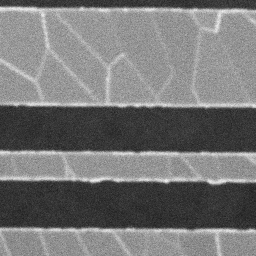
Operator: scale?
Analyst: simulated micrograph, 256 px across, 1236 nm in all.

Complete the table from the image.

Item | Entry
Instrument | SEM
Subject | lines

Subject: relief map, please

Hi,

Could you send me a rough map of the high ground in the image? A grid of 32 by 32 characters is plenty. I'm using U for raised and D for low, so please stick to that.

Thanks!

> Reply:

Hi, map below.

DDDDDDDDDDDDDDDDDDDDDDDDDDDDDDDD
UUUUUUUUUUUUUUUUUUUUUUUUUUUUUUUU
UUUUUUUUUUUUUUUUUUUUUUUUUUUUUUUU
UUUUUUUUUUUUUUUUUUUUUUUUUUUUUUUU
UUUUUUUUUUUUUUUUUUUUUUUUUUUUUUUU
UUUUUUUUUUUUUUUUUUUUUUUUUUUUUUUU
UUUUUUUUUUUUUUUUUUUUUUUUUUUUUUUU
UUUUUUUUUUUUUUUUUUUUUUUUUUUUUUUU
UUUUUUUUUUUUUUUUUUUUUUUUUUUUUUUU
UUUUUUUUUUUUUUUUUUUUUUUUUUUUUUUU
UUUUUUUUUUUUUUUUUUUUUUUUUUUUUUUU
UUUUUUUUUUUUUUUUUUUUUUUUUUUUUUUU
UUUUUUUUUUUUUUUUUUUUUUUUUUUUUUUU
DDDDDDDDDDDDDDDDDDDDDDDDDDDDDDDD
DDDDDDDDDDDDDDDDDDDDDDDDDDDDDDDD
DDDDDDDDDDDDDDDDDDDDDDDDDDDDDDDD
DDDDDDDDDDDDDDDDDDDDDDDDDDDDDDDD
DDDDDDDDDDDDDDDDDDDDDDDDDDDDDDDD
DDDDDDDDDDDDDDDDDDDDDDDDDDDDDDDD
UUUUUUUUUUUUUUUUUUUUUUUUUUUUUUUU
UUUUUUUUUUUUUUUUUUUUUUUUUUUUUUUU
UUUUUUUUUUUUUUUUUUUUUUUUUUUUUUUU
DDDDDDDDDDUUUDUUUUUUUUUUUUUUUUUU
DDDDDDDDDDDDDDDDDDDDDDDDDDDDDDDD
DDDDDDDDDDDDDDDDDDDDDDDDDDDDDDDD
DDDDDDDDDDDDDDDDDDDDDDDDDDDDDDDD
DDDDDDDDDDDDDDDDDDDDDDDDDDDDDDDD
DDDDDDDDDDDDDDDDDDDDDDDDDDDDDDDD
DDDDDDDDDDDDDDDDDDDDDDDDDDDDDDDD
UUUUUUUUUUUUUUUUUUUUUUUUUUUUUUUU
UUUUUUUUUUUUUUUUUUUUUUUUUUUUUUUU
UUUUUUUUUUUUUUUUUUUUUUUUUUUUUUUU